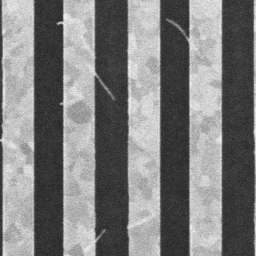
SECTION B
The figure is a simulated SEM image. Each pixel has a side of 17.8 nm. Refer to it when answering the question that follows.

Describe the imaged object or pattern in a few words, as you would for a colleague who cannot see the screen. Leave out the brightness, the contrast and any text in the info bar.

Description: lines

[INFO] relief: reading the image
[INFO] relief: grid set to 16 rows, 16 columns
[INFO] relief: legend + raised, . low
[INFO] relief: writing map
++..++..++..++..
++..++..++..++..
++..++..++..++..
++..++..++..++..
++..++..++..++..
++..++..++..++..
++..++..++..++..
++..++..++..++..
++..++..++..++..
++..++..++..++..
++..++..++..++..
++..++..++..++..
++..++..++..++..
++..++..++..++..
++..++..++..++..
++..++..++..++..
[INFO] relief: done